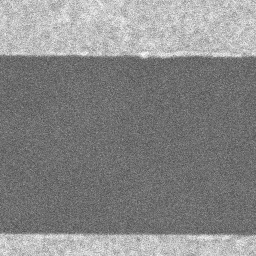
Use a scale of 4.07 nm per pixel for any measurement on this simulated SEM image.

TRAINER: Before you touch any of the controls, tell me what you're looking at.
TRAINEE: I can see one or a few lines or trenches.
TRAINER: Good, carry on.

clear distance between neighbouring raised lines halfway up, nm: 733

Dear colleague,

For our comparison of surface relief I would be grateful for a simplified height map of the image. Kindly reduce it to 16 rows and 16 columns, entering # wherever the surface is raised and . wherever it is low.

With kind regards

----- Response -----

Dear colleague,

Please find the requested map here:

################
################
################
.........##.....
................
................
................
................
................
................
................
................
................
................
................
################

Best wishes